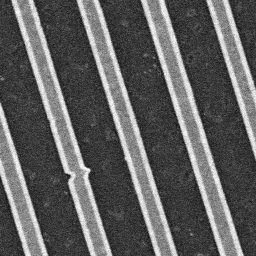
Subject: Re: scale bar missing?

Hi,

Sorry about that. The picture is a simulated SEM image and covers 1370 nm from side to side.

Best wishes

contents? one or a few lines or trenches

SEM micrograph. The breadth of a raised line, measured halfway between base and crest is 83.7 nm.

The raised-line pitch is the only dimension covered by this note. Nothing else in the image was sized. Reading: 0.332 um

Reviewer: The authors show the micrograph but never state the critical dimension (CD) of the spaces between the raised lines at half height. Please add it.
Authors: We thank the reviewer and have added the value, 0.245 microns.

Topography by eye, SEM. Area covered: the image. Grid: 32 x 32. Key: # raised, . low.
..##......##......##......##....
..##......##......###......##...
..###......##......##......##...
...##......##......##......##...
...##......##......##......###..
...##.......##......##......##..
....##......##......##......##..
....##......##......##......##..
....##.......##......##......##.
.....##......##......##......##.
.....##......##......##......##.
.....##......##.......##......##
......##......##......##......##
......##......##......##......##
......##......##......###......#
#......##......##......##......#
#......##......##......##......#
#......##......##......###......
#......##.......##......##......
##......##......##......##......
##......##......##......##......
##.......##......##......##.....
.##......##......##......##.....
.##......##......##......##.....
.##......##......###......##....
..##......##......##......##....
..##......##......##......##....
..##......##......##......###...
...##......##......##......##...
...##......##......##......##...
...##......##......##......###..
...##......###......##......##..